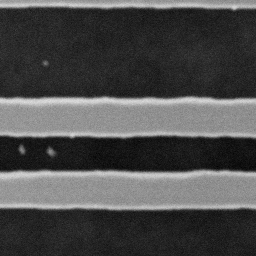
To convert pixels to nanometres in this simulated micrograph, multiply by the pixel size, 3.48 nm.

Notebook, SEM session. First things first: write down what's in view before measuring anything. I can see lines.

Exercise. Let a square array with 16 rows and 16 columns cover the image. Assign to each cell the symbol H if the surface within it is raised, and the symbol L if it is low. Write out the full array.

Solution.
LLLLLLLLLLLLLLHL
LLLLLLLLLLLLLLLL
LLLLLLLLLLLLLLLL
LLLLLLLLLLLLLLLL
LLLLLLLLLLLLLLLL
LLLLLLLLLLLLLLLL
HHHHHHHHHHHHHHHH
HHHHHHHHHHHHHHHH
LHHLHHHHHLLLHHHH
LLLLLLLLLLLLLLLL
LLLLLLLLLLLLLLLL
HHHHHHHHHHHHHHHH
HHHHHHHHHHHHHHHH
LLLLLLLLLLLLLLLL
LLLLLLLLLLLLLLLL
LLLLLLLLLLLLLLLL